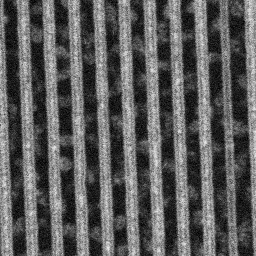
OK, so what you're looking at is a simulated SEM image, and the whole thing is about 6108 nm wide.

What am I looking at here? parallel lines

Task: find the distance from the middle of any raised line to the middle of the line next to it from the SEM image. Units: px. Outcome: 25.1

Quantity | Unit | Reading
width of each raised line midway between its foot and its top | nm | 394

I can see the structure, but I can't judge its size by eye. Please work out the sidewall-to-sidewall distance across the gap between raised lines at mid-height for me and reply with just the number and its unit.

206 nanometers